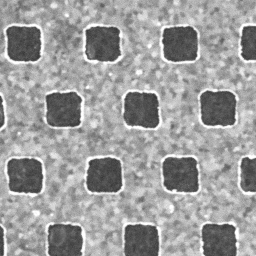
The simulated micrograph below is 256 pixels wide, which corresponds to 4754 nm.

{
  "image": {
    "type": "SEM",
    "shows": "a regular array of holes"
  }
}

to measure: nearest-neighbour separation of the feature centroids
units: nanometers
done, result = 1410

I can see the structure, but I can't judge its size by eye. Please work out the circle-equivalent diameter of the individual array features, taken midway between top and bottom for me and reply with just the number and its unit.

726 nanometers